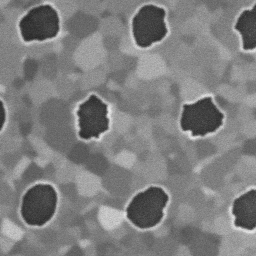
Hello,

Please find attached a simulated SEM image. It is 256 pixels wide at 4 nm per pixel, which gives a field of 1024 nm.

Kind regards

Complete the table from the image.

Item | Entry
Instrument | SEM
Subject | holes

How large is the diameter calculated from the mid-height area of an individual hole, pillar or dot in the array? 161 nm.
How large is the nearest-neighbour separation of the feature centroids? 105 pixels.